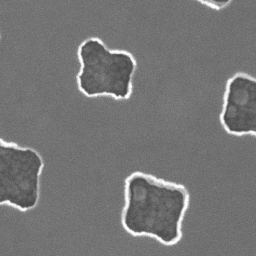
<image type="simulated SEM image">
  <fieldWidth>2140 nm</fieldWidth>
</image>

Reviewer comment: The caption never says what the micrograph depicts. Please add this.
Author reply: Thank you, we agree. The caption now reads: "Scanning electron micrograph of holes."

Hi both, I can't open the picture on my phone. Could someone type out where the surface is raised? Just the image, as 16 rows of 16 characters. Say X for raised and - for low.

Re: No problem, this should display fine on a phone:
XXXXXXXXXXXXXXXX
XXXXXXXXXXXXXXXX
XXXXXXXXXXXXXXXX
XXXXX---XXXXXXXX
XXXXX---XXXXXXXX
XXXXX---XXXXXX--
XXXXXXXXXXXXXX--
XXXXXXXXXXXXXX--
XXXXXXXXXXXXXXXX
--XXXXXXXXXXXXXX
--XXXXXXXXXXXXXX
--XXXXXX--XXXXXX
--XXXXXX----XXXX
XXXXXXXX---XXXXX
XXXXXXXXX--XXXXX
XXXXXXXXXXXXXXXX